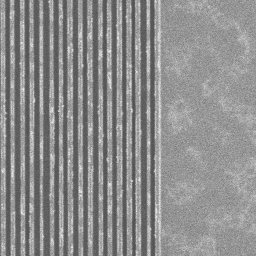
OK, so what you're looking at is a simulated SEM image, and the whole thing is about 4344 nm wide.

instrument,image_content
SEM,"parallel lines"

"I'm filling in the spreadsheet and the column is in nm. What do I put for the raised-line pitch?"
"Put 164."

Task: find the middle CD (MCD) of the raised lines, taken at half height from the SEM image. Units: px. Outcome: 4.87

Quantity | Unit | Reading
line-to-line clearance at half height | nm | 80.6